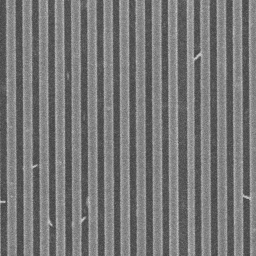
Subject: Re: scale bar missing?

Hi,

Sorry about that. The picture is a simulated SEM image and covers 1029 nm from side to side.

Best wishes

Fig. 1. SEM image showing parallel lines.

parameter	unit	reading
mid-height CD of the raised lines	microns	0.0341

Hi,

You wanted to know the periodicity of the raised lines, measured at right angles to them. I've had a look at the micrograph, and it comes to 16.1 px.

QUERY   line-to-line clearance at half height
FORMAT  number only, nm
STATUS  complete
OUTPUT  30.1